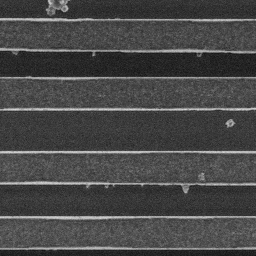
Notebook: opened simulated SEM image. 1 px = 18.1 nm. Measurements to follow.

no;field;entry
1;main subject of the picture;lines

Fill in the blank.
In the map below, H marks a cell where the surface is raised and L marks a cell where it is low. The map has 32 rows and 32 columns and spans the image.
LLLLLLLLLLLLLLLLLLLLLLLLLLLLLLLL
LLLLLLLLLLLLLLLLLLLLLLLLLLLLLLLL
HHHHHHHHHHHHHHHHHHHHHHHHHHHHHHHH
HHHHHHHHHHHHHHHHHHHHHHHHHHHHHHHH
HHHHHHHHHHHHHHHHHHHHHHHHHHHHHHHH
HHHHHHHHHHHHHHHHHHHHHHHHHHHHHHHH
LLLLLLLLLLLLLLLLLLLLLLLLLLLLLLLL
LLLLLLLLLLLLLLLLLLLLLLLLLLLLLLLL
LLLLLLLLLLLLLLLLLLLLLLLLLLLLLLLL
LLLLLLLLLLLLLLLLLLLLLLLLLLLLLLLL
HHHHHHHHHHHHHHHHHHHHHHHHHHHHHHHH
HHHHHHHHHHHHHHHHHHHHHHHHHHHHHHHH
HHHHHHHHHHHHHHHHHHHHHHHHHHHHHHHH
HHHHHHHHHHHHHHHHHHHHHHHHHHHHHHHH
LLLLLLLLLLLLLLLLLLLLLLLLLLLLLLLL
LLLLLLLLLLLLLLLLLLLLLLLLLLLLLLLL
LLLLLLLLLLLLLLLLLLLLLLLLLLLLLLLL
LLLLLLLLLLLLLLLLLLLLLLLLLLLLLLLL
LLLLLLLLLLLLLLLLLLLLLLLLLLLLLLLL
HHHHHHHHHHHHHHHHHHHHHHHHHHHHHHHH
HHHHHHHHHHHHHHHHHHHHHHHHHHHHHHHH
HHHHHHHHHHHHHHHHHHHHHHHHHHHHHHHH
HHHHHHHHHHHHHHHHHHHHHHHHHHHHHHHH
LLLLLLLLLLLLLLLLLLLLLLLLLLLLLLLL
LLLLLLLLLLLLLLLLLLLLLLLLLLLLLLLL
LLLLLLLLLLLLLLLLLLLLLLLLLLLLLLLL
LLLLLLLLLLLLLLLLLLLLLLLLLLLLLLLL
HHHHHHHHHHHHHHHHHHHHHHHHHHHHHHHH
HHHHHHHHHHHHHHHHHHHHHHHHHHHHHHHH
HHHHHHHHHHHHHHHHHHHHHHHHHHHHHHHH
HHHHHHHHHHHHHHHHHHHHHHHHHHHHHHHH
LLLLLLLLLLLLLLLLLLLLLLLLLLLLLLLL